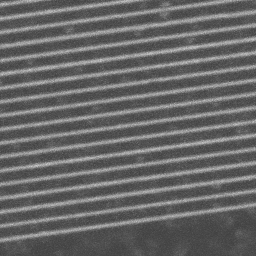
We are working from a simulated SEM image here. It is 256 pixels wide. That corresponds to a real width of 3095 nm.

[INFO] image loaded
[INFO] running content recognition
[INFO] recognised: parallel lines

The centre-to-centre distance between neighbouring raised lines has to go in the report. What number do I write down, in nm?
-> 166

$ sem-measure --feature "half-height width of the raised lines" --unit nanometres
32.9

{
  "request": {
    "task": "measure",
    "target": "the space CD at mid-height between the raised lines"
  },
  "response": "132 nm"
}